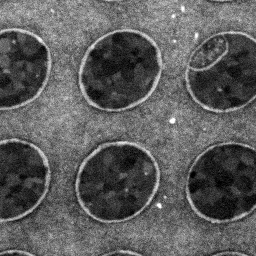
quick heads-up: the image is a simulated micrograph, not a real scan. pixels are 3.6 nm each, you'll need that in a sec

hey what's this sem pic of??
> raised bodies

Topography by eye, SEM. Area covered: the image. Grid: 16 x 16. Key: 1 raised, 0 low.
0000000000000000
0000000000000000
1110001110000011
1110011111000011
1110011111001111
1110011111001111
1100001110001110
0000000000000000
0000000000000000
1110001110000111
1110011111001111
1110011111001111
1110011110001111
1000001100000110
0000000000000000
0000000000000000